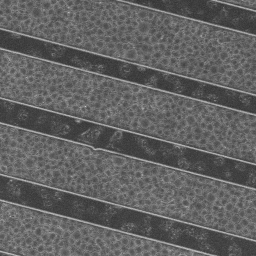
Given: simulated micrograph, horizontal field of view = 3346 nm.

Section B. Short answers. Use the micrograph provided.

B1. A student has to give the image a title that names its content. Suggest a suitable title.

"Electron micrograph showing one or a few lines or trenches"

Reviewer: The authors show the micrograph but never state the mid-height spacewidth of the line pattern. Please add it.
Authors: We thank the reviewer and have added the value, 47.8 px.